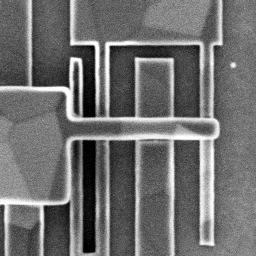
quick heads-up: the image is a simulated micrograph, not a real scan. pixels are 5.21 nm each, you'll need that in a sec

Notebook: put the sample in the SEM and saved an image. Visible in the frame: wiring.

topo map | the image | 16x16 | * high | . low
................
................
................
................
................
****............
****............
*************...
*************...
****............
****............
****............
****............
................
................
................